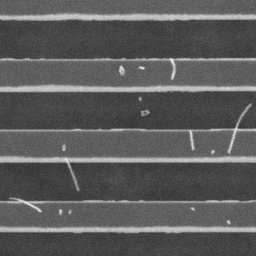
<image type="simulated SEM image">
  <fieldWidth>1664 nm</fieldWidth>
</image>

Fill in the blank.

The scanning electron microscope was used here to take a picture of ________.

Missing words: lines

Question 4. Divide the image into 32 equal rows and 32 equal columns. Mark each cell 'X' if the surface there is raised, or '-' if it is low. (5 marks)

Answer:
XXXXXXXXXXXXXXXXXXXXXXXXXXXXXXXX
XXXXXXXXXXXXXXXXXXXXXXXXXXXXXXXX
--------------------------------
--------------------------------
--------------------------------
--------------------------------
--------------------------------
XXXXXXXXXXXXXXXXXXXXXXXXXXXXXXXX
XXXXXXXXXXXXXXXXXXXXXXXXXXXXXXXX
XXXXXXXXXXXXXXXXXXXXXXXXXXXXXXXX
XXXXXXXXXXXXXXXXXXXXXXXXXXXXXXXX
--------------------------------
--------------------------------
--------------------------------
--------------------------------
--------------------------------
XXXXXXXXXXXXXXXXXXXXXXXXXXXXXXXX
XXXXXXXXXXXXXXXXXXXXXXXXXXXXXXXX
XXXXXXXXXXXXXXXXXXXXXXXXXXXXXXXX
XXXXXXXXXXXXXXXXXXXXXXXXXXXXXXXX
--------------------------------
--------------------------------
--------------------------------
--------------------------------
--------------------------------
XXXXXXXXXXXXXXXXXXXXXXXXXXXXXXXX
XXXXXXXXXXXXXXXXXXXXXXXXXXXXXXXX
XXXXXXXXXXXXXXXXXXXXXXXXXXXXXXXX
XXXXXXXXXXXXXXXXXXXXXXXXXXXXXXXX
--------------------------------
--------------------------------
--------------------------------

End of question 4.